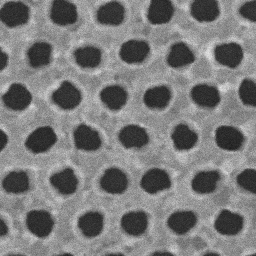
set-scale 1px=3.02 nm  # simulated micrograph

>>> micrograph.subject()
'a regular array of holes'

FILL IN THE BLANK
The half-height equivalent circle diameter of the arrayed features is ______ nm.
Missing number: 89.5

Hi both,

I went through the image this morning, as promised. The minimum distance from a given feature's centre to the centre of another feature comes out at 138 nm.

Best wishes